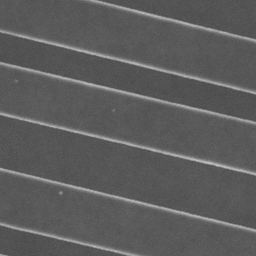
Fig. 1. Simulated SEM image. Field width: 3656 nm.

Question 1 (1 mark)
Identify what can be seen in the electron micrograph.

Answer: lines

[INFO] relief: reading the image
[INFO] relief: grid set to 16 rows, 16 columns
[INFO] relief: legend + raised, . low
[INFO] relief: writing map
++++++++........
++++++++++++....
..++++++++++++++
......++++++++++
+++.......++++++
+++++++........+
+++++++++++.....
.++++++++++++++.
......++++++++++
..........++++++
..............++
++++............
++++++++........
++++++++++++....
..++++++++++++++
......++++++++++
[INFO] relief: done